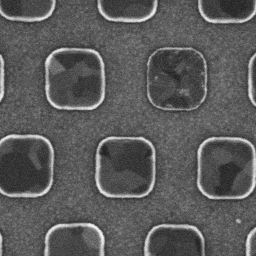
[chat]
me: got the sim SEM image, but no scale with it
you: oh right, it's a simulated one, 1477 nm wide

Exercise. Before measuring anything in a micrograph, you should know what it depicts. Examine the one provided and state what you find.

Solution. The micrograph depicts raised bodies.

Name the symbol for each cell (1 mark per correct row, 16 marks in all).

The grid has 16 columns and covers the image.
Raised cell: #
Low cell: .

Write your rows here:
###...####...###
................
................
...###..........
...###..........
...###..........
...###..........
................
................
###...####..####
###...####..####
###...####..####
................
................
...###...###....
...###...####..#